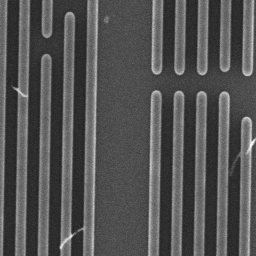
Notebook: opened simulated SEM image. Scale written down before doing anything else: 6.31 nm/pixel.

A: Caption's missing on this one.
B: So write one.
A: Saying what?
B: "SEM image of groups of lines, slits or small figures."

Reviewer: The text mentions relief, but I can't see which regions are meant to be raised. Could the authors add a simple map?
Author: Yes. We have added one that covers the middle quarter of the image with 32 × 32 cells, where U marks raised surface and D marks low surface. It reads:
UUDDDDUUDDDDDDDDDDDDDDUUDDDDUUDD
UUDDDDUUDDDDDDDDDDDDDDUUDDDDUUDD
UUDDDDUUDDDDDDDDDDDDDDDDDDDDUDDD
UUDDDDUUDDDDDDDDDDDDDDDDDDDDDDDD
UUDDDDUUDDDDDDDDDDDDDDDDDDDDDDDD
UUDDDDUUDDDDDDDDDDDDDDDDDDDDDDDD
UUDDDDUUDDDDDDDDDDDDDDDDDDDDDDDD
UUDDDDUUDDDDDDDDDDDDDDUUDDDDUUDD
UUDDDDUUDDDDDDDDDDDDDDUUDDDDUUDD
UUDDDDUUDDDDDDDDDDDDDDUUDDDDUUDD
UUDDDDUUDDDDDDDDDDDDDDUUDDDDUUDD
UUDDDDUUDDDDDDDDDDDDDDUUDDDDUUDD
UUDDDUUUDDDDDDDDDDDDDDUUDDDDUUDD
UUDDDUUUDDDDDDDDDDDDDDUUDDDDUUDD
UUDDDUUUDDDDDDDDDDDDDDUUDDDDUUDD
UUDDDUUUDDDDDDDDDDDDDDUUDDDUUUDD
UUDDDUUUDDDDDDDDDDDDDDUUDDDUUUDD
UUDDDUUUDDDDDDDDDDDDDDUUDDDUUUDD
UUDDDUUUDDDDDDDDDDDDDDUUDDDUUUDD
UUDDDUUUDDDDDDDDDDDDDDUUDDDUUUDD
UUDDDUUUDDDDDDDDDDDDDDUUDDDUUUDD
UUDDDUUUDDDDDDDDDDDDDDUUDDDUUUDD
UUDDDUUUDDDDDDDDDDDDDDUUDDDUUUDD
UUDDDUUUDDDDDDDDDDDDDDUUDDDUUUDD
UUDDDUUUDDDDDDDDDDDDDDUUDDDUUUDD
UUDDDUUUDDDDDDDDDDDDDDUUDDDUUDDD
UUDDDUUUDDDDDDDDDDDDDDUUDDDUUDDD
UUDDDUUUDDDDDDDDDDDDDDUUDDDUUDDD
UUDDDUUUDDDDDDDDDDDDDDUUDDDUUDDD
UUDDDUUUDDDDDDDDDDDDDUUUDDDUUDDD
UUDDDUUUDDDDDDDDDDDDDUUUDDDUUDDD
UUDDDUUUDDDDDDDDDDDDDUUUDDDUUDDD